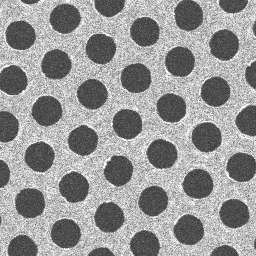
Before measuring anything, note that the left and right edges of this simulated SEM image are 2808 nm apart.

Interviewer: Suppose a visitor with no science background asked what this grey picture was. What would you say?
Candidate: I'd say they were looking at a regular array of holes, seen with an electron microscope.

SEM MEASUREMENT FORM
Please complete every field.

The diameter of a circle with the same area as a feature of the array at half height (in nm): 331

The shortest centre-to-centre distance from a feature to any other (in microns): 0.505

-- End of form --